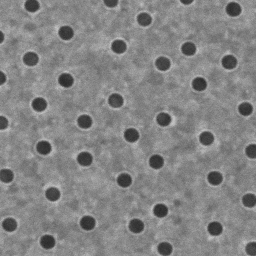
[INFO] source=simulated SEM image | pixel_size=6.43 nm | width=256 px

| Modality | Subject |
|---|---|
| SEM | a regular array of holes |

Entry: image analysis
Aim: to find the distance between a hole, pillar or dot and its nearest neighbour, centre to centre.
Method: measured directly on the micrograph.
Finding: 240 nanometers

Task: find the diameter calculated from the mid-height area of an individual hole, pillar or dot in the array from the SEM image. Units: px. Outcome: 16.5